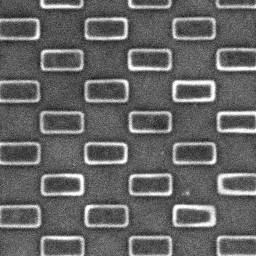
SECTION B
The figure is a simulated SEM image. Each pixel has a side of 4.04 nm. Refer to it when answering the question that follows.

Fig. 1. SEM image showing groups of lines, slits or small figures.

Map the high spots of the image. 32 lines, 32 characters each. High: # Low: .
.....#####......#####......#####
................................
..##.......#####......#####.....
#####......#####......#####.....
#####......#####......#####.....
................................
......####......#####......#####
.....#####......#####......#####
.....#####.......####.......####
................................
#####......#####......####......
#####......#####......#####.....
#####......#####......####......
................................
.....#####......#####......#####
.....#####......#####......#####
......####......................
................................
#####......#####......#####.....
#####......#####......#####.....
................................
................................
.....#####......#####.......####
.....#####......#####.......####
................................
................................
#####......#####......#####.....
#####......#####......#####.....
................................
................................
.....#####......#####......#####
.....#####......#####......#####